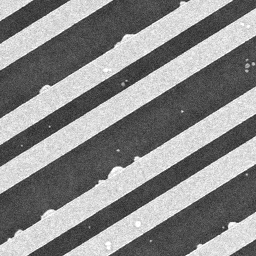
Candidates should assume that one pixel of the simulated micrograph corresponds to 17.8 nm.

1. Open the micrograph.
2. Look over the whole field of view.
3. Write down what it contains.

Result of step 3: lines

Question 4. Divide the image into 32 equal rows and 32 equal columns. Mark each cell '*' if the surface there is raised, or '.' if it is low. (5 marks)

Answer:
***.....*****..........*****....
**....******..........*****....*
.....*****..........*****.....**
...*****..........*****.....****
..*****.........******....******
*****..........*****.....*****..
****.........******....******...
**..........*****.....*****.....
..........*****.....*****.......
.........*****....******........
.......*****.....*****..........
.....******....******..........*
....*****.....*****..........***
..*****.....*****...........****
.*****....******..........*****.
****.....*****...........*****..
***....*****...........*****....
*.....*****..........******....*
....*****...........*****.....**
..******..........*****.....****
.*****..........******....******
****..........******.....*****..
***..........******....******...
*...........*****.....*****.....
..........*****.....*****.......
........******....******........
......******.....*****..........
.....******....******.........**
....*****.....*****..........***
..*****.....*****..........*****
******....******..........*****.
****.....*****..........*****...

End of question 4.